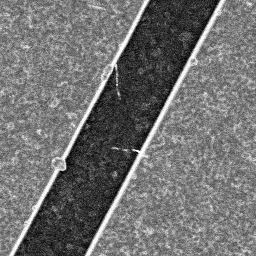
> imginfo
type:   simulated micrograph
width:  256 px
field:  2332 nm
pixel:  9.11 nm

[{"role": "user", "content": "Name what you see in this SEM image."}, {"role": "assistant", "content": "one or a few lines or trenches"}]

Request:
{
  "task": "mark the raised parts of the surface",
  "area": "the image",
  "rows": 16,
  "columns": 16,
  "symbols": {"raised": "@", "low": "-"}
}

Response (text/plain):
@@@@@@@@@-----@@
@@@@@@@@-----@@@
@@@@@@@@-----@@@
@@@@@@@-----@@@@
@@@@@@@-----@@@@
@@@@@@-----@@@@@
@@@@@@----@@@@@@
@@@@@-----@@@@@@
@@@@@----@@@@@@@
@@@@-----@@@@@@@
@@@@----@@@@@@@@
@@@-----@@@@@@@@
@@@----@@@@@@@@@
@@-----@@@@@@@@@
@-----@@@@@@@@@@
@-----@@@@@@@@@@